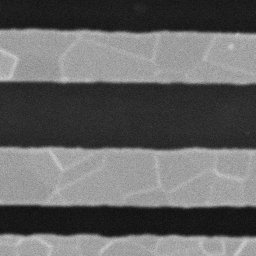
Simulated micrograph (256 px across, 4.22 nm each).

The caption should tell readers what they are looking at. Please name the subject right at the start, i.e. lines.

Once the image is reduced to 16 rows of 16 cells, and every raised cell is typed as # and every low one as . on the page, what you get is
................
................
################
################
################
................
................
................
................
################
################
################
################
................
................
################